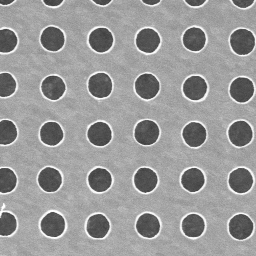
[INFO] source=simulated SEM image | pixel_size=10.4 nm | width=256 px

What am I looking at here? a regular array of holes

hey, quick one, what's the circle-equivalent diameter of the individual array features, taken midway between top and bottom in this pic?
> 263 nanometres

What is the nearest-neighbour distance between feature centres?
476 nanometres